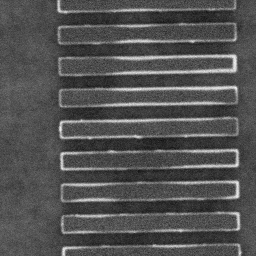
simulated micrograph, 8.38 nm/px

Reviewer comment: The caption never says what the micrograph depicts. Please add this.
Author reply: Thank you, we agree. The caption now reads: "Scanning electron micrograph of groups of lines, slits or small figures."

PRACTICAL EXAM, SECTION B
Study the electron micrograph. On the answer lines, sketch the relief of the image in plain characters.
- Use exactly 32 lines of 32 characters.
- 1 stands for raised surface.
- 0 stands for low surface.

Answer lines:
00000001111111111111111111111000
00000000000000000000000000000000
00000000000000000000000000000000
00000000111111111111111111111000
00000001111111111111111111111000
00000000000000000000000000000000
00000000000000000000000000000000
00000000111111111111111111111000
00000001111111111111111111111000
00000000000000000000000000000000
00000000000000000000000000000000
00000000111111111111111111111100
00000001111111111111111111111100
00000000000000000000000000000000
00000000000000000000000000000000
00000000111111111111111111111100
00000000111111111111111111111100
00000000000000000000000000000000
00000000000000000000000000000000
00000000111111111111111111111100
00000000111111111111111111111100
00000000000000000000000000000000
00000000000000000000000000000000
00000000111111111111111111111100
00000000111111111111111111111000
00000000000000000000000000000000
00000000000000000000000000000000
00000000111111111111111111111100
00000000111111111111111111111100
00000000000000000000000000000000
00000000000000000000000000000000
00000000111111111111111111111100